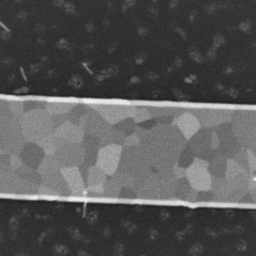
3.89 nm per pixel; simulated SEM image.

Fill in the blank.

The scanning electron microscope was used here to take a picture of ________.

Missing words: one or a few lines or trenches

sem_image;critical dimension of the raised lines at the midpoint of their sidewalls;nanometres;383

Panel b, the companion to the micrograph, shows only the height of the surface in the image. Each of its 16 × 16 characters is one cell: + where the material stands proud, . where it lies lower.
................
................
................
................
................
................
++++++++++......
++++++++++++++++
++++++++++++++++
++++++++++++++++
++++++++++++++++
++++++++++++++++
.....+.+++++++++
................
................
................